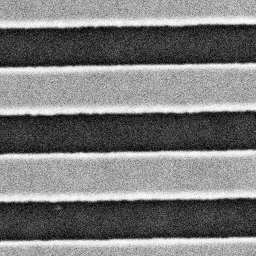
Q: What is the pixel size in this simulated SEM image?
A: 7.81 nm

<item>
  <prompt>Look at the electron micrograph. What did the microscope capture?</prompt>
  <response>lines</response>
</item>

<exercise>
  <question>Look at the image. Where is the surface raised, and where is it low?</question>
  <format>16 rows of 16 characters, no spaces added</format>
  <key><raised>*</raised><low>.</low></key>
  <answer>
****************
*************...
................
................
****************
****************
****************
................
................
..........******
****************
****************
******..........
................
................
****************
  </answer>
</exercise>